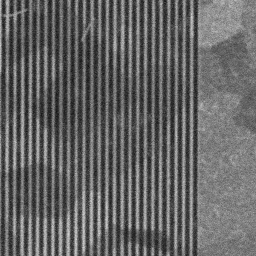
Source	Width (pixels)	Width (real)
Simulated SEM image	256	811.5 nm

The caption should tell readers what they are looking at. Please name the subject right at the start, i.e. parallel lines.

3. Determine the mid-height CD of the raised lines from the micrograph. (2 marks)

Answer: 2.11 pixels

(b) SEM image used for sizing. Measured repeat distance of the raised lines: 24.4 nm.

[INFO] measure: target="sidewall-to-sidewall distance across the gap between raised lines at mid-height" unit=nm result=18.2